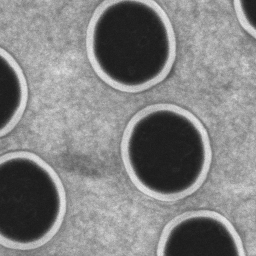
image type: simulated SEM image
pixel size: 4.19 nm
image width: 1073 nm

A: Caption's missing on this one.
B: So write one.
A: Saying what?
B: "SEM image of raised bodies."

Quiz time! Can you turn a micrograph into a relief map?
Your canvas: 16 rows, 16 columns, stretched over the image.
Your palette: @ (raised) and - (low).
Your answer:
------@@@@-----@
------@@@@-----@
------@@@@@-----
------@@@@@-----
@-----@@@@------
@@------@-------
@---------------
@-------@@@@----
--------@@@@@---
--------@@@@@---
@@@-----@@@@@---
@@@@-----@@@----
@@@@------------
@@@@--------@@--
@@@-------@@@@@-
----------@@@@@-